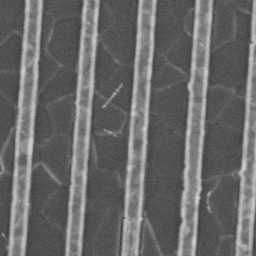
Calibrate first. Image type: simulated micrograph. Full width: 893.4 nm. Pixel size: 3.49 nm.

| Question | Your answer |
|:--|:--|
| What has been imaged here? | parallel lines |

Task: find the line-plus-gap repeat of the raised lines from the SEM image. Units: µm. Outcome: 0.197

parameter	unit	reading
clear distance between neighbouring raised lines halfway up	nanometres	152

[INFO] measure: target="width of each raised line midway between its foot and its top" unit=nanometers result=43.9